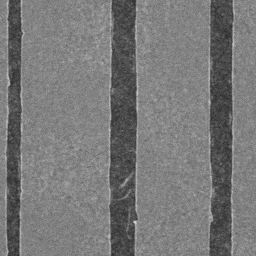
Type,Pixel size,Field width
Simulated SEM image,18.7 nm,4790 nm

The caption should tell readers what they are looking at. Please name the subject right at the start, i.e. one or a few lines or trenches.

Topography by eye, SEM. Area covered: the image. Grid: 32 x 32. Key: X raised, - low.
X--XXXXXXXXXXX---XXXXXXXXX---XXX
X--XXXXXXXXXXX---XXXXXXXXX---XXX
X--XXXXXXXXXXX---XXXXXXXXX---XXX
X--XXXXXXXXXXX---XXXXXXXXX---XXX
X--XXXXXXXXXXX---XXXXXXXXX---XXX
X--XXXXXXXXXXX---XXXXXXXXX---XXX
X--XXXXXXXXXXX---XXXXXXXXX---XXX
X--XXXXXXXXXXX--XXXXXXXXXX---XXX
X--XXXXXXXXXXX---XXXXXXXXX---XXX
X--XXXXXXXXXXX---XXXXXXXXX---XXX
X--XXXXXXXXXXX---XXXXXXXXX---XXX
X--XXXXXXXXXXX---XXXXXXXXX---XXX
X--XXXXXXXXXXX---XXXXXXXXX---XXX
X--XXXXXXXXXXX---XXXXXXXXX---XXX
X--XXXXXXXXXXX---XXXXXXXXX--XXXX
X--XXXXXXXXXXX---XXXXXXXXX--XXXX
X--XXXXXXXXXXX---XXXXXXXXX---XXX
X--XXXXXXXXXXX---XXXXXXXXXX--XXX
X--XXXXXXXXXXX---XXXXXXXXX---XXX
X--XXXXXXXXXXX---XXXXXXXXX---XXX
X--XXXXXXXXXXX---XXXXXXXXX---XXX
X--XXXXXXXXXXX---XXXXXXXXX---XXX
X--XXXXXXXXXXX---XXXXXXXXX---XXX
X--XXXXXXXXXXX---XXXXXXXXX---XXX
X--XXXXXXXXXXX---XXXXXXXXX---XXX
X--XXXXXXXXXXX---XXXXXXXXX---XXX
X--XXXXXXXXXXX---XXXXXXXXX---XXX
X--XXXXXXXXXXX---XXXXXXXXX---XXX
X--XXXXXXXXXXX---XXXXXXXXX---XXX
X--XXXXXXXXXXX---XXXXXXXXX---XXX
X--XXXXXXXXXXX---XXXXXXXXX---XXX
X--XXXXXXXXXXX---XXXXXXXXX---XXX